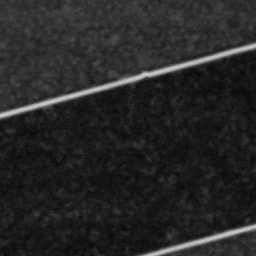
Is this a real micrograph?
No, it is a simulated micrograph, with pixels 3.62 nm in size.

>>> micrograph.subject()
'one or a few lines or trenches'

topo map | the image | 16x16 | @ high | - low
----------------
----------------
----------------
-------------@@@
----------@@@@@@
------@@@@@@@@@@
---@@@@@@@@@@@@@
@@@@@@@@@@@@@@@@
@@@@@@@@@@@@@@@@
@@@@@@@@@@@@@@@@
@@@@@@@@@@@@@@@@
@@@@@@@@@@@@@@@@
@@@@@@@@@@@@@@@@
@@@@@@@@@@@@@@@@
@@@@@@@@@@@@@@@-
@@@@@@@@@@@-----